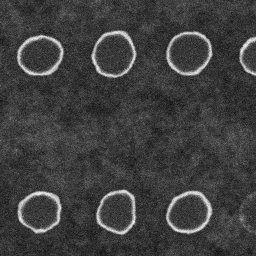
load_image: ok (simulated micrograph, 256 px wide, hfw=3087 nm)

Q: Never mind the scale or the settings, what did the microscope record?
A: raised bodies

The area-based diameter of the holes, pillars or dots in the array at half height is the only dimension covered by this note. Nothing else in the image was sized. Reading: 503 nanometres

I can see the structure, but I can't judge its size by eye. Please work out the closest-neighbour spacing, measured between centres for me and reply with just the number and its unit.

0.89 microns